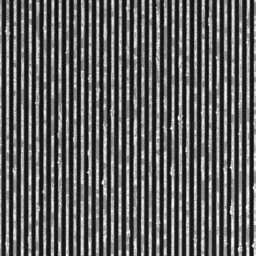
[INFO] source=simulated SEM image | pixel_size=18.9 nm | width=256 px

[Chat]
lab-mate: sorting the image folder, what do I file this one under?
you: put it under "parallel lines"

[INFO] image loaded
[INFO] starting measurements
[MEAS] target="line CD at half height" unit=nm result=49.5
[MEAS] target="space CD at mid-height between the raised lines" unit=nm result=82.5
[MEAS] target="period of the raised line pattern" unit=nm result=142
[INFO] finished